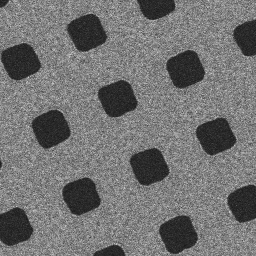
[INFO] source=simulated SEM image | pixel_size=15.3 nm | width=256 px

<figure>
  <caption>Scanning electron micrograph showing a regular array of holes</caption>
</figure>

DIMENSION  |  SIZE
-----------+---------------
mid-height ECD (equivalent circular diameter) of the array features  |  567 nm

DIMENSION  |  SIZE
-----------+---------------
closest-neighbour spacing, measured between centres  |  1.12 microns